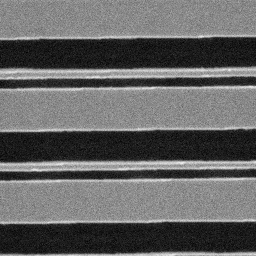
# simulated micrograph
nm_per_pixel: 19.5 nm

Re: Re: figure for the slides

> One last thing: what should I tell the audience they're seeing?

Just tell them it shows lines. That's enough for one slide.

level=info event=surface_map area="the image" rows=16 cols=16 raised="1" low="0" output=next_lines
1111111111111111
1111111111111111
0000000000000000
0000000000000000
1111111111111111
1111111111111111
1111111111111111
1111111111111111
0000000000000000
0000000000000000
1111111111111111
1111111111111111
1111111111111111
1111111111111111
0000000000000000
0000000000000000